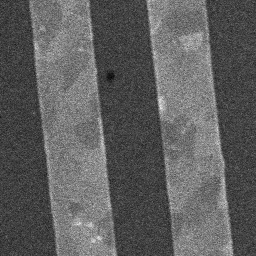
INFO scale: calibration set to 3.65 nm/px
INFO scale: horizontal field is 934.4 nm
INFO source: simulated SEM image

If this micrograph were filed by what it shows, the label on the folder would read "one or a few lines or trenches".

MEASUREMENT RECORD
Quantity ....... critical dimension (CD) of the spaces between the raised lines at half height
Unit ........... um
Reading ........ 0.216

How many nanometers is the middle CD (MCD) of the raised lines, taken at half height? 209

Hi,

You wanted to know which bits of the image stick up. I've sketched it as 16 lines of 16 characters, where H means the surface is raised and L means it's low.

LLHHHHLLLHHHHLLL
LLHHHHLLLHHHHLLL
LLHHHHLLLHHHHLLL
LLHHHHLLLLHHHLLL
LLHHHHLLLLHHHLLL
LLHHHHLLLLHHHLLL
LLHHHHLLLLHHHLLL
LLLHHHLLLLHHHHLL
LLLHHHLLLLHHHHLL
LLLHHHHLLLHHHHLL
LLLHHHHLLLHHHHLL
LLLHHHHLLLHHHHLL
LLLHHHHLLLLHHHLL
LLLHHHHLLLLHHHLL
LLLHHHHLLLLHHHLL
LLLLHHHLLLLHHHLL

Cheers